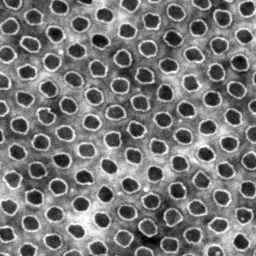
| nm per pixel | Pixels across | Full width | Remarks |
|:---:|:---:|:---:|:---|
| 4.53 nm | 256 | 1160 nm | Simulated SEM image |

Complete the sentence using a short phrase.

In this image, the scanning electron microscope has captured a regular array of raised bodies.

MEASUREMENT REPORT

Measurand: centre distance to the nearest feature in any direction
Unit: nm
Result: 118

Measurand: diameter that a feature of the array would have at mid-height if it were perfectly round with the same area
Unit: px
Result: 17.2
